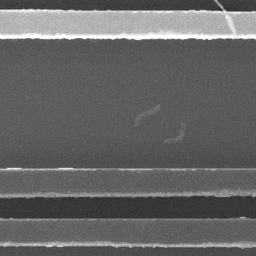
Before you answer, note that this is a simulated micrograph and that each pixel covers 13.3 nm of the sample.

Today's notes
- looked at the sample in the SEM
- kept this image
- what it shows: lines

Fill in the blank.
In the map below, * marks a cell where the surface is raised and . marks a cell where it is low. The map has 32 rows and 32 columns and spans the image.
................................
*****************************...
********************************
********************************
********************************
................................
................................
................................
................................
................................
................................
................................
................................
................................
................................
................................
................................
................................
................................
................................
................................
********************************
********************************
********************************
******************.**...........
................................
................................
********************************
********************************
********************************
********************************
................................